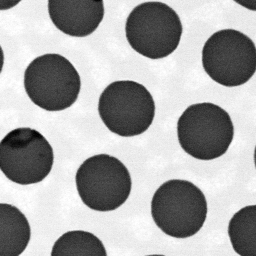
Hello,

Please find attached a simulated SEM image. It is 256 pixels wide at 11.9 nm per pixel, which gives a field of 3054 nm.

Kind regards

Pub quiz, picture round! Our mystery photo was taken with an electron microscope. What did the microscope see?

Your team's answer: holes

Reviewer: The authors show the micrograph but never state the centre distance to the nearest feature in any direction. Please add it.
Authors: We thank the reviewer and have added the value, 0.947 micrometres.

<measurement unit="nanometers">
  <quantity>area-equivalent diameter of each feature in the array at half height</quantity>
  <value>682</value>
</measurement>